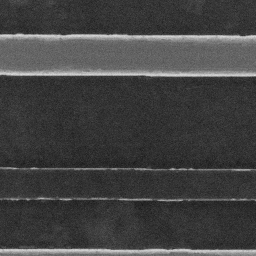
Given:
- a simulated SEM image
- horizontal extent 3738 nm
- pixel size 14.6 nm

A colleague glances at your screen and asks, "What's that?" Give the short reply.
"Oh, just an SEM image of lines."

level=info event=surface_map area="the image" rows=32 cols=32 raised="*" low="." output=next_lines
................................
................................
................................
................................
.****...........................
********************************
********************************
********************************
********************************
................................
................................
................................
................................
................................
................................
................................
................................
................................
................................
................................
................................
********************************
********************************
********************************
********************************
................................
................................
................................
................................
................................
................................
********************************